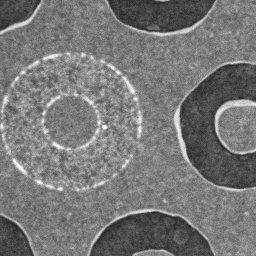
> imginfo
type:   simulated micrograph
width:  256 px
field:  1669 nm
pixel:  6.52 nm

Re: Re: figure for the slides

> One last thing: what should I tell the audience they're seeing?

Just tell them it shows ring-shaped grooves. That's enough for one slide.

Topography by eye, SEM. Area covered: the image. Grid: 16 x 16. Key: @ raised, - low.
--@@@@@------@@@
-@@@@@@@----@@@@
@@@@@@@@@@@@@@@@
@@@@@@@@@@@@@@@@
@@@@@@@@@@@@@---
@@@@@@@@@@@@----
@@@@@@@@@@@---@@
@@@@@@@@@@@--@@@
@@@@@@@@@@@---@@
@@@@@@@@@@@@---@
@@@@@@@@@@@@----
@@@@@@@@@@@@@---
@@@@@@@@@@@@@@@@
@@@@@@@@---@@@@@
-@@@@@------@@@@
--@@@@-------@@@